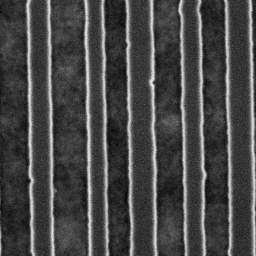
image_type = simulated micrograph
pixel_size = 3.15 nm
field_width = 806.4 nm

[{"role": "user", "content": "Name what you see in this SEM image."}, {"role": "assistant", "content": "parallel lines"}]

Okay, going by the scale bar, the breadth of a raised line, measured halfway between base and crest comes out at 68.4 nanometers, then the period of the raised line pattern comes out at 158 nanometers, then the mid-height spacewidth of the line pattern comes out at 0.0849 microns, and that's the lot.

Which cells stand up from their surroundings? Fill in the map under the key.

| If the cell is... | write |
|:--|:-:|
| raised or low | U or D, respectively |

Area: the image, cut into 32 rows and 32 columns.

DDDUUUDDDDDUUDDDUUUDDDUUUDDDUUUD
DDDUUUDDDDDUUDDDUUUDDDUUUDDDUUUD
DDDDUUDDDDDUUDDDUUUDDDDUUDDDUUUD
DDDDUUDDDDDUUDDDUUUDDDDUUDDDUUUD
DDDDUUDDDDDUUDDDUUUDDDDUUDDDUUUD
DDDDUUDDDDDUUDDDUUUDDDDUUDDDUUUD
DDDDUUDDDDDUUDDDUUUDDDDUUDDDUUUU
DDDDUUDDDDDUUDDDUUUDDDDUUDDDUUUU
DDDDUUDDDDDUUDDDUUUDDDDUUDDDUUUU
DDDDUUDDDDDUUDDDUUUDDDDUUDDDUUUU
DDDDUUDDDDDUUDDDUUUDDDDUUDDDUUUU
DDDDUUDDDDDUUDDDUUUDDDDUUDDDUUUU
DDDDUUDDDDDUUDDDUUUDDDDUUDDDUUUU
DDDDUUDDDDDUUDDDUUUDDDDUUDDDUUUU
DDDDUUDDDDDUUDDDUUUDDDDUUDDDUUUU
DDDDUUDDDDDUUDDDUUUDDDDUUDDDDUUU
DDDDUUDDDDDUUDDDUUUDDDDUUDDDDUUU
DDDDUUDDDDDUUDDDUUUDDDDUUDDDDUUU
DDDDUUDDDDDUUDDDUUUDDDDUUDDDDUUU
DDDDUUDDDDDUUDDDUUUDDDDUUDDDDUUU
DDDDUUDDDDDUUDDDUUUDDDDUUDDDDUUU
DDDDUUDDDDDUUDDDUUUDDDDUUUDDDUUU
DDDDUUUDDDDUUDDDUUUDDDDUUUDDDUUU
DDDDUUUDDDDUUDDDUUUDDDDUUDDDDUUU
DDDDUUUDDDDUUDDDUUUDDDDUUDDDDUUU
DDDDUUUDDDDUUDDDUUUDDDDUUUDDDUUU
DDDDUUUDDDDUUDDDUUUDDDDUUDDDDUUU
DDDDUUUDDDDUUDDDUUUDDDDUUDDDDUUU
DDDDUUUDDDDUUDDDUUUDDDDUUDDDDUUU
DDDDUUUDDDDUUDDDUUUDDDDUUUDDDUUU
DDDDUUUDDDDUUDDDUUUDDDDUUUDDDUUU
DDDDUUUDDDDUUDDDUUUUDDDUUUDDDUUU